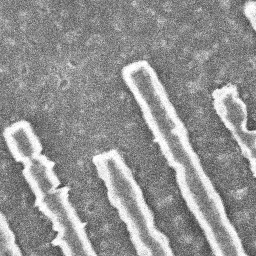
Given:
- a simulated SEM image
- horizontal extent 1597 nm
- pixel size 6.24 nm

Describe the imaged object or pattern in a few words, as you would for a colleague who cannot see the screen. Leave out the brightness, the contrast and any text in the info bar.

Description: one or a few lines or trenches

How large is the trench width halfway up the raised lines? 289 nanometers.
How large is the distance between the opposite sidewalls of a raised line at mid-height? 129 nm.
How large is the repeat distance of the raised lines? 418 nanometres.